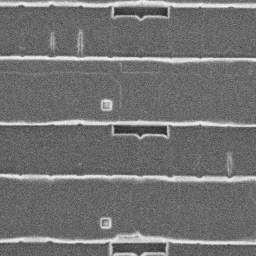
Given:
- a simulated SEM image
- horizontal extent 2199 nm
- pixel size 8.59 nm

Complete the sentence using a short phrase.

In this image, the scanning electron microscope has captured wiring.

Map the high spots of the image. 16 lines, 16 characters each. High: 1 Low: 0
0000000000000000
0000000000000000
0000000000000000
0000000000000000
1111111111111111
1111111111111111
1111111111111111
1111111111111111
0000000000000000
0000000000000000
0000000000000000
1111111111111111
1111111111111111
1111111111111111
1111111111111111
0000000000000000